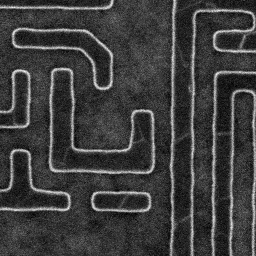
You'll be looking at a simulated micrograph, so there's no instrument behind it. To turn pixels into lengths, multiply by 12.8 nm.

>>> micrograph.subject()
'wiring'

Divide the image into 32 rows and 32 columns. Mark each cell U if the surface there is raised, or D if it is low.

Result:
UUUUUUUUUUUUUUDDDDDDDDUUUUUUUUUU
DDDDDDDDDDDDDDDDDDDDDDUUUDDDDDDU
DDDDDDDDDDDDDDDDDDDDDDUUDDDDDDDD
DDDDDDDDDDDDDDDDDDDDDDUUDDDDDDDU
DDUUUUUUUUUUDDDDDDDDDDUUDDDUUUUU
DDUUUUUUUUUUUDDDDDDDDDUUDDDUUUUU
DDDDDDDDDDUUUUDDDDDDDDUUDDDDDDDD
DDDDDDDDDDDUUUDDDDDDDDUUDDDDDDDD
DDDDDDDDDDDDUUDDDDDDDDUUDDDDDDDD
DDUUDDDUUDDDUUDDDDDDDDUUDDDUUUUU
DDUUDDDUUDDDUUDDDDDDDDUUDDDUUUUU
DDUUDDUUUDDDDDDDDDDDDDUUDDDUUUDU
DDUUDDUUUDDDDDDDDDDDDDUUDDDUUDDD
DUUUDDUUUDDDDDDDDDDDDUUUDDDUUDDD
UUUUDDUUUDDDDDDDDUUDDUUUDDDUUDDD
UUUDDDUUUDDDDDDDDUUDDUUUDDDUUDDD
DDDDDDUUUDDDDDDDDUUDDDUUDDDUUDDD
DDDDDDUUUDDDDDDDUUUDDDUUDDDUUDDD
DDDDDDUUUDDDDDDDUUUDDUUUDDDUUDDD
DUUUDDUUUUUUUUUUUUUDDUUUDDDUUDDD
DUUUDDUUUUUUUUUUUUUDDUUUDDDUUDDD
DUUUDDDDDDDDDUUDUUUDDUUUDDDUUDDD
DUUUDDDDDDDDDDDDDDDDDUUUDDDUUDDD
DUUUDDDDDDDDDDDDDDDDDDUUDDDUUDDD
UUUUUUUUUDDDUUUUUUUDDUUUDDDUUDDD
UUUUUUUUUDDDUUUUUUUDDUUUDDDUUDDD
DDDDDDDDDDDDDDDDDDDDDDUUDDDUUDDD
DDDDDDDDDDDDDDDDDDDDDDUUDDDUUDDD
DDDDDDDDDDDDDDDDDDDDDUUUDDDUUDDD
DDDDDDDDDDDDDDDDDDDDDUUUDDDUUDDD
DDDDDDDDDDDDDDDDDDDDDUUUDDDUUDDD
DDDDDDDDDDDDDDDDDDDDDUUUDDDUUDDD